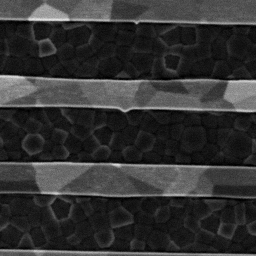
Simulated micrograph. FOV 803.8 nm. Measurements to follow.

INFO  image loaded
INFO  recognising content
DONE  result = one or a few lines or trenches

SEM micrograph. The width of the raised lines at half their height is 95.4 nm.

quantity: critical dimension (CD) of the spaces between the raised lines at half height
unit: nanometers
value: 179